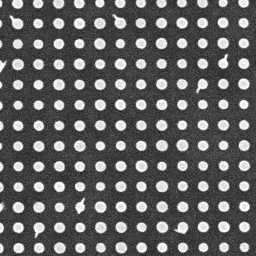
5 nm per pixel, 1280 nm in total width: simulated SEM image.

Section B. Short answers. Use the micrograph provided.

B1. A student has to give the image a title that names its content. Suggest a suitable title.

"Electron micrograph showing a regular array of raised bodies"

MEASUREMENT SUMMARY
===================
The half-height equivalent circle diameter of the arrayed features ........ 47.9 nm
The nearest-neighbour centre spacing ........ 0.101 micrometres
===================